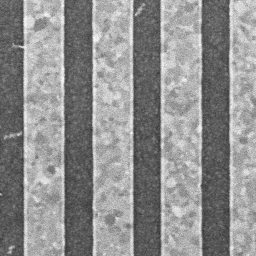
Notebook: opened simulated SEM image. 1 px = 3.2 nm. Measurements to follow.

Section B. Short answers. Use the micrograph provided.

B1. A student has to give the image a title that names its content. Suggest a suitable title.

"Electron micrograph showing one or a few lines or trenches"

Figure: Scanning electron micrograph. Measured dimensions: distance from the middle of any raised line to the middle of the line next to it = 0.219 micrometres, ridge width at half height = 122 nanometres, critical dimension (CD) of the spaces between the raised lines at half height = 98.4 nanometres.